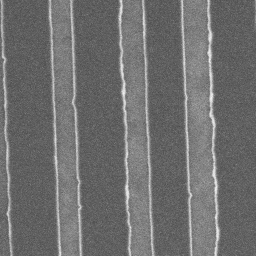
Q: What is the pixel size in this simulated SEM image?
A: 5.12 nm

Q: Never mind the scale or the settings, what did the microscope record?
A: one or a few lines or trenches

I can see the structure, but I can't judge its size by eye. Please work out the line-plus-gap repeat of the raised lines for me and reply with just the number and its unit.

350 nm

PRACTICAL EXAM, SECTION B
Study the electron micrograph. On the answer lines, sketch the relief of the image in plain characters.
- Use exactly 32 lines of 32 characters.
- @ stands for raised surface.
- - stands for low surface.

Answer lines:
@@@@@@---@@@@@@---@@@@@---@@@@@@
@@@@@@---@@@@@@---@@@@@---@@@@@@
@@@@@@---@@@@@@---@@@@@---@@@@@@
@@@@@@---@@@@@@---@@@@@---@@@@@@
@@@@@@@--@@@@@@---@@@@@---@@@@@@
@@@@@@@--@@@@@@---@@@@@---@@@@@@
@@@@@@@--@@@@@@---@@@@@---@@@@@@
@@@@@@@--@@@@@@---@@@@@---@@@@@@
@@@@@@@--@@@@@@---@@@@@---@@@@@@
@@@@@@@--@@@@@@---@@@@@---@@@@@@
@@@@@@@--@@@@@@@--@@@@@---@@@@@@
-@@@@@@--@@@@@@---@@@@@---@@@@@@
-@@@@@@--@@@@@@@--@@@@@---@@@@@@
-@@@@@@--@@@@@@@--@@@@@---@@@@@@
-@@@@@@--@@@@@@@--@@@@@---@@@@@@
-@@@@@@--@@@@@@@--@@@@@----@@@@@
-@@@@@@---@@@@@@--@@@@@----@@@@@
-@@@@@@---@@@@@@---@@@@----@@@@@
-@@@@@@---@@@@@@---@@@@---@@@@@@
-@@@@@@---@@@@@@--@@@@@----@@@@@
-@@@@@@---@@@@@@---@@@@@---@@@@@
-@@@@@@---@@@@@@---@@@@@---@@@@@
-@@@@@@---@@@@@@---@@@@@---@@@@@
-@@@@@@---@@@@@@---@@@@@---@@@@@
-@@@@@@---@@@@@@---@@@@@---@@@@@
-@@@@@@---@@@@@@---@@@@@---@@@@@
-@@@@@@---@@@@@@---@@@@@---@@@@@
-@@@@@@---@@@@@@---@@@@@---@@@@@
-@@@@@@---@@@@@@---@@@@@---@@@@@
-@@@@@@---@@@@@@---@@@@@---@@@@@
-@@@@@@---@@@@@@---@@@@@---@@@@@
-@@@@@@@--@@@@@@---@@@@@---@@@@@